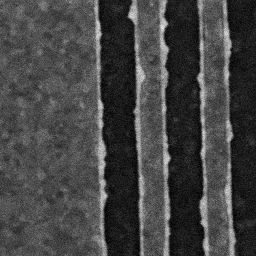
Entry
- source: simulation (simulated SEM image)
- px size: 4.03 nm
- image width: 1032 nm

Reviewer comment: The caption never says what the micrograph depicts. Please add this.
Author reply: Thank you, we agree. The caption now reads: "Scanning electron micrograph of one or a few lines or trenches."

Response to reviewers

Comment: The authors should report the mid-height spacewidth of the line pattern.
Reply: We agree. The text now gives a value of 140 nm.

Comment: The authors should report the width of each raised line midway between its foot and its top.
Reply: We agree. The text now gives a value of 0.118 µm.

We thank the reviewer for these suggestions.